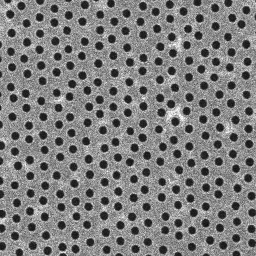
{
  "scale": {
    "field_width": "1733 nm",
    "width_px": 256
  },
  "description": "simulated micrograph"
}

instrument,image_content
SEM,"a regular array of holes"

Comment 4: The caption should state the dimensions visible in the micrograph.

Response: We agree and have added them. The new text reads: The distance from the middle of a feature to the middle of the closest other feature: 98.7 nm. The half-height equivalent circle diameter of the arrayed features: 8.21 pixels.